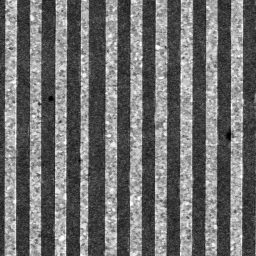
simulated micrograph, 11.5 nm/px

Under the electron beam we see parallel lines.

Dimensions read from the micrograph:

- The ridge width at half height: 127 nm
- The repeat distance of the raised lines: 290 nm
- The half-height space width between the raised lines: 161 nm